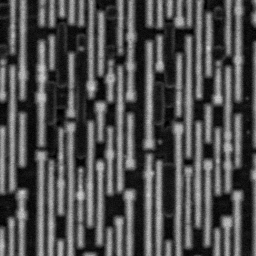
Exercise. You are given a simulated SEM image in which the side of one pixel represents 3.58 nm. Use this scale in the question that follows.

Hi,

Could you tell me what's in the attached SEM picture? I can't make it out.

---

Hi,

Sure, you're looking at wiring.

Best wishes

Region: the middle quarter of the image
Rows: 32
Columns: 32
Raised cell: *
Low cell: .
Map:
******************..************
******************..************
******************..***..*******
********..********..***..*******
********..********..***..*******
********...*******..************
...*****...*******..*****.....**
...*****...*******..*****.....**
...**.**...*******..*****.....**
...**...**********..*****.....**
...**...***..**.....*****.....**
...**...***..**.....*****.....**
...**...**...*****..*****.....**
...**...**...*****..*****.....**
.*********...*****..*****.....**
**********.*.*****..**.....*****
*****************...**.....*****
*****************...**.....*****
.****************...***....*****
.*****************..***....*****
.*******...*******..***.....****
.*******..********..***.....****
.*******..********..**......****
.*******..********..**......****
.**..*************..***....***..
***..*************..************
****************....************
***.***********.....************
***..**********.....**********..
***..**********.....**********..
***..**********.....**********..
***..*************..**********..